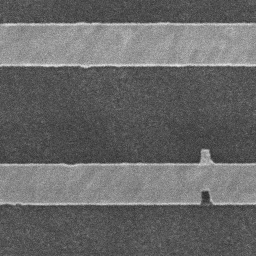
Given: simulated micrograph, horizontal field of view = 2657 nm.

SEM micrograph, one or a few lines or trenches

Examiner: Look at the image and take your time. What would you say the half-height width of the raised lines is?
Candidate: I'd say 420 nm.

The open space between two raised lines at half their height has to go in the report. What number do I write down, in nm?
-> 1030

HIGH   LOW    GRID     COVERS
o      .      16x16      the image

................
.....o..........
oooooooooooooooo
oooooooooooooooo
................
................
................
................
................
................
oooooooooooooooo
oooooooooooooooo
oooooooooooo.ooo
................
................
................